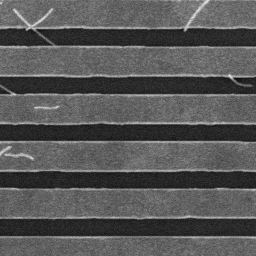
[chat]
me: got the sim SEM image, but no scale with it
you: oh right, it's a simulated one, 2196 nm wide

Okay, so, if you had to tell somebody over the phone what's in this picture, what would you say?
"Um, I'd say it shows lines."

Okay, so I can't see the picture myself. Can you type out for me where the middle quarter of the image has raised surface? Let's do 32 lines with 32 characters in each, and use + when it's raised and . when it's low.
++++++++++++++++++++++++++++++++
++++++++++++++++++++++++++++++++
++++++++++++++++++++++++++++++++
................................
................................
................................
................................
................................
++++++++++++++++++++++++++++++++
++++++++++++++++++++++++++++++++
++++++++++++++++++++++++++++++++
++++++++++++++++++++++++++++++++
++++++++++++++++++++++++++++++++
++++++++++++++++++++++++++++++++
++++++++++++++++++++++++++++++++
................................
................................
................................
................................
++++++++++++++++++++++++++++++++
++++++++++++++++++++++++++++++++
++++++++++++++++++++++++++++++++
++++++++++++++++++++++++++++++++
++++++++++++++++++++++++++++++++
++++++++++++++++++++++++++++++++
++++++++++++++++++++++++++++++++
++++++++++++++++++++++++++++++++
................................
................................
................................
................................
++++++++++++++++++++++++++++++++